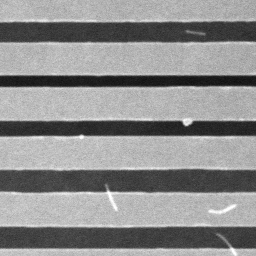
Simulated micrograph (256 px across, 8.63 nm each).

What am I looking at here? lines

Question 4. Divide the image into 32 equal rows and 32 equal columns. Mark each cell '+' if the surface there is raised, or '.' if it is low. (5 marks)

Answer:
++++++++++++++++++++++++++++++++
++++++++++++++++++++++++++++++++
++++++++++++++++++++++++++++++++
................................
................................
++++++++++++++++++++++++++++++++
++++++++++++++++++++++++++++++++
++++++++++++++++++++++++++++++++
++++++++++++++++++++++++++++++++
................................
................................
++++++++++++++++++++++++++++++++
++++++++++++++++++++++++++++++++
++++++++++++++++++++++++++++++++
++++++++++++++++++++++++++++++++
.......................+........
................................
++++++++++++++++++++++++++++++++
++++++++++++++++++++++++++++++++
++++++++++++++++++++++++++++++++
++++++++++++++++++++++++++++++++
................................
................................
................................
++++++++++++++++++++++++++++++++
++++++++++++++++++++++++++++++++
++++++++++++++++++++++++++++++++
++++++++++++++++++++++++++++++++
................................
................................
................................
++++++++++++++++++++++++++++++++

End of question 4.